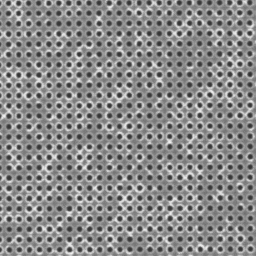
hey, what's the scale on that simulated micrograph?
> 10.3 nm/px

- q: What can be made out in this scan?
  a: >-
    a regular array of holes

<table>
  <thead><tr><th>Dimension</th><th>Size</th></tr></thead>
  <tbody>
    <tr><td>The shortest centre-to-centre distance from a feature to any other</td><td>102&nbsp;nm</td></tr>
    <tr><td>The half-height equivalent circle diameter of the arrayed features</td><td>0.0568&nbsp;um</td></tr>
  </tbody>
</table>